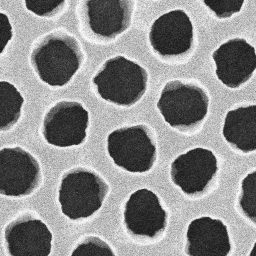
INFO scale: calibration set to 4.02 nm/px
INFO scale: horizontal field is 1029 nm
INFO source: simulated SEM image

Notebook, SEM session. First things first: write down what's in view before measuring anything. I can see a regular array of holes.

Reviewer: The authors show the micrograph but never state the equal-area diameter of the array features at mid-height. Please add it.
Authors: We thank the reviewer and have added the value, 46.3 px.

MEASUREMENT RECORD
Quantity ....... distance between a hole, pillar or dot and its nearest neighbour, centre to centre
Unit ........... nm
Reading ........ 264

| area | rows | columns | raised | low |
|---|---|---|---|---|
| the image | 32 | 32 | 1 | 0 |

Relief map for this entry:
11100000111000001111111111000011
11110011111000001111100111100011
01111111111000001111000011111111
01111111111000001110000011111111
01111111111110111110000011111111
01111000001111111110000011110001
11110000001111111111000111100000
11110000001111001111111111100000
11111000001110000011111111100000
11111000011100000011111111100001
01111100111100000011100111110011
00111111111100000011000001111111
00011111111110000111000000111111
00011110001111111111000000111100
00111100000111111111000000110000
01111100000111111111100011110000
11111000000111000011111111110000
11111100001111000001111111110000
10111111111111000001111111111100
00001111111111000001110000011111
00000111111111100001110000011111
00000111100111111111100000011111
00000111000001111111110000111100
00001111000001111111111001111100
11111110000001110000111111111100
11111111000001110000111111111100
11111111000011110000011111111100
11101111111111110000011100011110
10000011111111110000111100001111
10000011111111111111111000000111
10000011110001111111111100000111
10000011100000111111111100000110